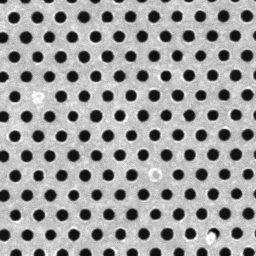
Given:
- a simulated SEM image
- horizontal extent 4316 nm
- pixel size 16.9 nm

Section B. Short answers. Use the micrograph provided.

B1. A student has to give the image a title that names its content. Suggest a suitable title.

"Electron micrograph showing a regular array of holes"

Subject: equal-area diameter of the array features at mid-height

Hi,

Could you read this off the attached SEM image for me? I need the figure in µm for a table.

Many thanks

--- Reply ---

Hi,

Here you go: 0.209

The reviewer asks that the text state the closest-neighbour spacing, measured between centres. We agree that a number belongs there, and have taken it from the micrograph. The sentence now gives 383 nanometres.